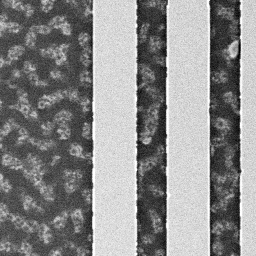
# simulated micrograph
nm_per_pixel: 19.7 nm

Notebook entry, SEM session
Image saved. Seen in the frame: one or a few lines or trenches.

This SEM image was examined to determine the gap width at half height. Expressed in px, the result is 31.1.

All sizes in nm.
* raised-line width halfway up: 840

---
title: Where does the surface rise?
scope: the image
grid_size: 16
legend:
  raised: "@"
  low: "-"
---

------@@--@@@--@
------@@--@@@--@
------@@--@@@--@
------@@--@@@--@
------@@--@@@--@
------@@--@@@--@
------@@--@@@--@
------@@--@@@--@
------@@--@@@--@
------@@--@@@--@
------@@--@@@--@
------@@--@@@--@
------@@--@@@--@
------@@--@@@--@
------@@--@@@--@
------@@--@@@--@